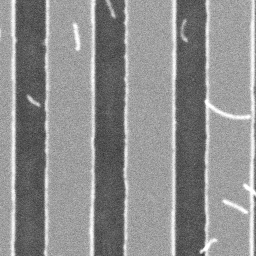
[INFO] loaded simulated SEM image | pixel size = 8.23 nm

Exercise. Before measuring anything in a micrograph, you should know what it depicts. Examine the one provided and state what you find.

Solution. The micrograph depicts lines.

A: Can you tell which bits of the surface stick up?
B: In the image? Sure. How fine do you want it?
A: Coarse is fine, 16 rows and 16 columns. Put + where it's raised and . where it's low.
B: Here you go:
+..+++..+++..+++
+..+++..+++..+++
+..+++..+++..+++
+..+++..+++..+++
+..+++..+++..+++
+..+++..+++..+++
+..+++..+++..+++
+..+++..+++..+++
+..+++..+++..+++
+..+++..+++..+++
+..+++..+++..+++
+..+++..+++..+++
+..+++..+++..+++
+..+++..+++..+++
+..+++..+++..+++
+..+++..+++..+++